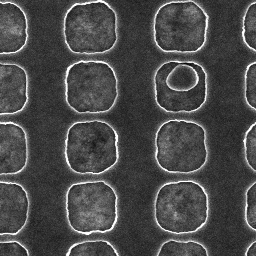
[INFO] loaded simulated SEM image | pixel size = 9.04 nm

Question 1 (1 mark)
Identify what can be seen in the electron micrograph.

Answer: a regular array of holes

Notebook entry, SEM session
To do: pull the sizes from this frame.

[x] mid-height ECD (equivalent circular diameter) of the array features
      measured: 474 nm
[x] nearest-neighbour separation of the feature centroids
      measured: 536 nanometres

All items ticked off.